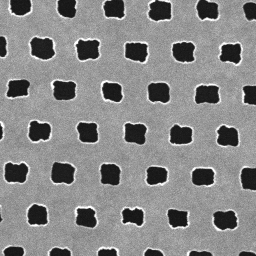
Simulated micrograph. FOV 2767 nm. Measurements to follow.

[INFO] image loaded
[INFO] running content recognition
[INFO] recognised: a regular array of holes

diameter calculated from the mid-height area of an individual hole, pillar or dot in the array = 233 nanometers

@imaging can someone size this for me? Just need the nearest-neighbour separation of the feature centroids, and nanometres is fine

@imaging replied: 503